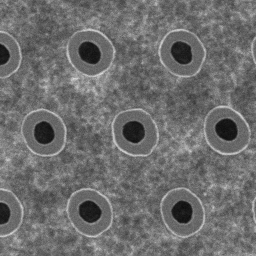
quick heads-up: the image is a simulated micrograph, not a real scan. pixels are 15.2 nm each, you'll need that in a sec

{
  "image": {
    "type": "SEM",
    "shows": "ring-shaped raised bodies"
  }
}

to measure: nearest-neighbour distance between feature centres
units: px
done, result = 91.4